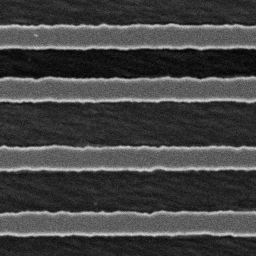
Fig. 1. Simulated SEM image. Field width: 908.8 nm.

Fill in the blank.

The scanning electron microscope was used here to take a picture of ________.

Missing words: lines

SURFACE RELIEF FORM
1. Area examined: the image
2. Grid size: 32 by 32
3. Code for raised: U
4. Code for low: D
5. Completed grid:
DDDDDDDDDDDDDDDDDDDDDDDDDDDDDDDD
DDDDDDDDDDDDDDDDDDDDDDDDDDDDDDDD
DDDDDDDDDDDDDDDDDDDDDDDDDDDDDDDD
UUUUUUUUUUUUUUUUUUUUUUUUUUUUUUUU
UUUUUUUUUUUUUUUUUUUUUUUUUUUUUUUU
UUUUUUUUUUUUUUUUUUUUUUUUUUUUUUUU
DDDDDDDDDDDDDDDDDDDDDDDDDDDDDDDD
DDDDDDDDDDDDDDDDDDDDDDDDDDDDDDDD
DDDDDDDDDDDDDDDDDDDDDDDDDDDDDDDD
DDDDDDDDDDDDDDDDDDDDDDDDDDDDDDDD
UUUUUUUUUUUUUUUUUUUUUUUUUUUUUUUU
UUUUUUUUUUUUUUUUUUUUUUUUUUUUUUUU
UUUUUUUUUUUUUUUUUUUUUUUUUUUUUUUU
DDDDDDDDDDDDDDDDDDDDDDDDDDDDDDDD
DDDDDDDDDDDDDDDDDDDDDDDDDDDDDDDD
DDDDDDDDDDDDDDDDDDDDDDDDDDDDDDDD
DDDDDDDDDDDDDDDDDDDDDDDDDDDDDDDD
DDDDDDDDDDDDDDDDDDDDDDDDDDDDDDDD
UUUUUUUUUUUUUUUUUUUUUUUUUUUUUUUU
UUUUUUUUUUUUUUUUUUUUUUUUUUUUUUUU
UUUUUUUUUUUUUUUUUUUUUUUUUUUUUUUU
DDDDDDDDDDDDDDDDDDDDDDDDDDDDDDDD
DDDDDDDDDDDDDDDDDDDDDDDDDDDDDDDD
DDDDDDDDDDDDDDDDDDDDDDDDDDDDDDDD
DDDDDDDDDDDDDDDDDDDDDDDDDDDDDDDD
DDDDDDDDDDDDDDDDDDDDDDDDDDDDDDDD
DDDUDUDUDDDDDDDDDDDDUDUUDDDUUUDU
UUUUUUUUUUUUUUUUUUUUUUUUUUUUUUUU
UUUUUUUUUUUUUUUUUUUUUUUUUUUUUUUU
DDUUUDDUDDDUDUDDDDDUDUDDDDDDDUUU
DDDDDDDDDDDDDDDDDDDDDDDDDDDDDDDD
DDDDDDDDDDDDDDDDDDDDDDDDDDDDDDDD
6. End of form